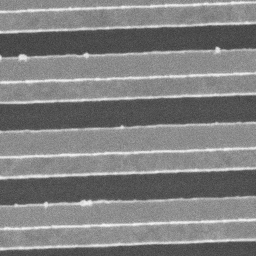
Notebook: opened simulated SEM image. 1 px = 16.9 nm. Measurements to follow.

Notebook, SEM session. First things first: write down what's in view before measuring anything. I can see lines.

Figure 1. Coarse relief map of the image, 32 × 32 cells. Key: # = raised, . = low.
################################
################################
################################
##############..................
................................
................................
......................##########
################################
################################
################################
################################
################################
###########.....................
................................
................................
...........................#.###
################################
################################
################################
################################
################################
#####################...........
................................
................................
................................
.....#.#########################
################################
################################
################################
################################
##################..............
................................